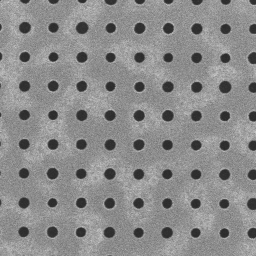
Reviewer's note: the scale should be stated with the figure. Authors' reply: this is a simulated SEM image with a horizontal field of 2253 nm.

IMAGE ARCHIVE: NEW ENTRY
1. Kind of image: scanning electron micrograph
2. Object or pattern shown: a regular array of holes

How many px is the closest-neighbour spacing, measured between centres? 28.5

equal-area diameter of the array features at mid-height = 94.3 nanometres